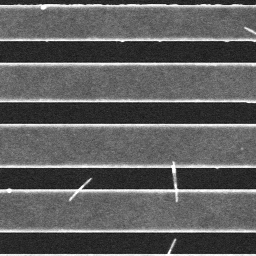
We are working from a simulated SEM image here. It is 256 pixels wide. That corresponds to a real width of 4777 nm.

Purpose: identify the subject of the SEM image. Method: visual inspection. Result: lines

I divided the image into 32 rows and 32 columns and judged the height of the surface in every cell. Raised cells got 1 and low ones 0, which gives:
00000000000000000000000000000000
11111111111111111111111111111111
11111111111111111111111111111111
11111111111111111111111111111111
11111111111111111111111111111111
00000000000000000000000000000000
00000000000000000000000000000000
00000000000000000000000000000000
11111111111111111111111111111111
11111111111111111111111111111111
11111111111111111111111111111111
11111111111111111111111111111111
11111111111111111111111111111111
00000000000000000000000000000000
00000000000000000000000000000000
00000000000000000000000000000000
11111111111111111111111111111111
11111111111111111111111111111111
11111111111111111111111111111111
11111111111111111111111111111111
11111111111111111111111111111111
00000000000000000000000000000000
00000000000000000000000000000000
00000000000000000000000000000000
11111111111111111111111111111111
11111111111111111111111111111111
11111111111111111111111111111111
11111111111111111111111111111111
11111111111111111111111111111111
00000000000000000000000000000000
00000000000000000000000000000000
00000000000000000000000000000000